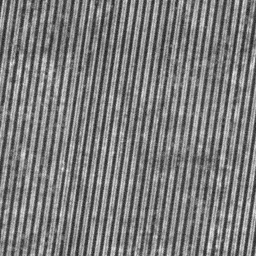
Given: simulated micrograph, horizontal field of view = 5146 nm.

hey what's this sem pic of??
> parallel lines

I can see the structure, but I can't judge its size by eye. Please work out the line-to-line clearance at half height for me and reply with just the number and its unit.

99.5 nm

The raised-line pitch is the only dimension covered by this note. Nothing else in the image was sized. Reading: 159 nanometres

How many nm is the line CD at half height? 59.7